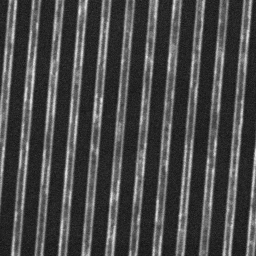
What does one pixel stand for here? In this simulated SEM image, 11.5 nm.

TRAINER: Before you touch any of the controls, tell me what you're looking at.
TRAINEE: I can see parallel lines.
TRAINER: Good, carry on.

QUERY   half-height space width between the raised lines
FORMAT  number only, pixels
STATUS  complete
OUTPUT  16.4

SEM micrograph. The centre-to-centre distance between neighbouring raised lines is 0.27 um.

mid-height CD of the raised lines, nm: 84.7